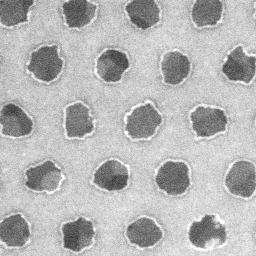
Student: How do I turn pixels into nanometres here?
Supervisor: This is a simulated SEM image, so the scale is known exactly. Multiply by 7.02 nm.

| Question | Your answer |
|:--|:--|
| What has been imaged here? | a regular array of raised bodies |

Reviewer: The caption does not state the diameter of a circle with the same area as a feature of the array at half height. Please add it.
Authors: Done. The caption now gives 248 nm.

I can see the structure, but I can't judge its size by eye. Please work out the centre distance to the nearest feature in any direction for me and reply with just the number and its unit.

0.443 microns